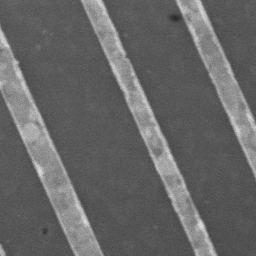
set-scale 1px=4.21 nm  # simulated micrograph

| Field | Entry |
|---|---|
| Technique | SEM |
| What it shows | one or a few lines or trenches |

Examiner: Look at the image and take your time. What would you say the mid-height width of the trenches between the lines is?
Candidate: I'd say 85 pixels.